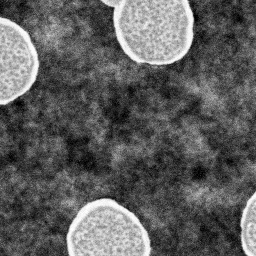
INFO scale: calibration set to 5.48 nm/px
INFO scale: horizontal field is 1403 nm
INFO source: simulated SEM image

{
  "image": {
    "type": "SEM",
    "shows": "raised bodies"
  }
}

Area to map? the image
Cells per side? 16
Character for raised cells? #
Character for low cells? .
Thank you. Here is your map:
.......#####....
#......#####....
##......####....
##......###.....
##..............
##..............
................
................
................
................
................
................
................
.....###.......#
....#####......#
....#####......#